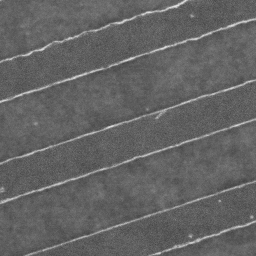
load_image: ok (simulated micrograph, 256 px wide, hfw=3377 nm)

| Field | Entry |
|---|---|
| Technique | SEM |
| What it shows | one or a few lines or trenches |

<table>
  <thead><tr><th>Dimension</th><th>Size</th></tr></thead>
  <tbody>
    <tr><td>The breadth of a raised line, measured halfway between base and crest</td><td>508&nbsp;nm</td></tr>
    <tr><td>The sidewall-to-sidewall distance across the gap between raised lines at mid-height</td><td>762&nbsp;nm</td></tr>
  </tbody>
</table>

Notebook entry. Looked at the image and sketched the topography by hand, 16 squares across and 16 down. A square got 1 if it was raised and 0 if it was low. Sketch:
0000000000011111
0000000111111110
0000111111110000
0111111110000000
1111110000000000
1110000000000011
0000000000011111
0000000011111111
0000011111111000
0011111111000000
1111111000000000
1111000000000001
1000000000001111
0000000001111111
0000001111111100
0001111111100000